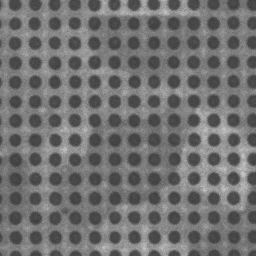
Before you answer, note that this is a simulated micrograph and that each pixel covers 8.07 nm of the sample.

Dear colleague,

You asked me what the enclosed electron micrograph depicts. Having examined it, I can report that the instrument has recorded a regular array of holes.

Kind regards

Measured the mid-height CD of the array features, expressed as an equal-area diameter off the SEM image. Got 114 nanometres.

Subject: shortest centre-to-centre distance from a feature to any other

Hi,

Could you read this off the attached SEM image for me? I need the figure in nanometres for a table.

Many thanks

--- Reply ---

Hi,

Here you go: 155